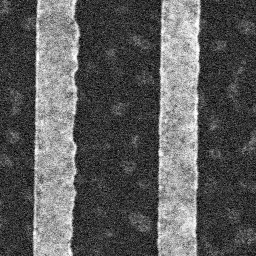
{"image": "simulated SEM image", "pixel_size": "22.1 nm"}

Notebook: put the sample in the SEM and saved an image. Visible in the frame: one or a few lines or trenches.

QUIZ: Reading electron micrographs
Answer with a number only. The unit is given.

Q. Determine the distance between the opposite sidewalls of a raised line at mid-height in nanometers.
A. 800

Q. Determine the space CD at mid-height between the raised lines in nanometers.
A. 1910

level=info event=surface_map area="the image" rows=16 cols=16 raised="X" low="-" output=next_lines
--XXX-----XX----
--XXX-----XX----
--XXX-----XX----
--XXX-----XX----
--XXX-----XX----
--XXX-----XX----
--XXX-----XX----
--XXX-----XX----
--XXX-----XX----
--XXX-----XX----
--XXX-----XX----
--XXX-----XX----
--XXX-----XX----
--XX------XX----
--XX------XX----
--XX------XX----